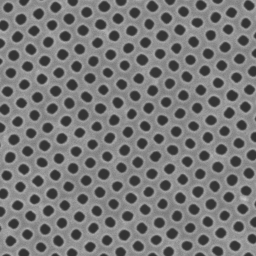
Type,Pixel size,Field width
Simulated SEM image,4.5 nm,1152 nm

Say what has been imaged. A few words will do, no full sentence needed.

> a regular array of holes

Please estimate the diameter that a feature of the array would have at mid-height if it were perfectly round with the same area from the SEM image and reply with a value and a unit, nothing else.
47.3 nm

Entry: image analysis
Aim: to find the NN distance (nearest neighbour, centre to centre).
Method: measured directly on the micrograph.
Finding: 79.4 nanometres